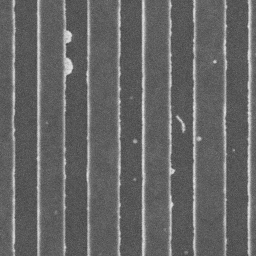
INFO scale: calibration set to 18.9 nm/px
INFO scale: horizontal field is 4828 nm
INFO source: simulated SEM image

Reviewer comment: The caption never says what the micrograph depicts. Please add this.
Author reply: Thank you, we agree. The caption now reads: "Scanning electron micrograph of lines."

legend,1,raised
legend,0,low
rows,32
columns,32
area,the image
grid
11000111000111100011100011110001
11000111000111100011100011110001
11000111000111100011100011110001
11000111000111100011100011110001
11000111100111100011100011110001
11000111000111100011100011110001
11000111000111100011100011110001
11000111100111100011100011110001
11000111100111100011100011110001
11000111000111100011100011110001
11000111000111100011100011110001
11000111000111100011100011110001
11000111000111100011100011110001
11000111000111100011100011110001
11000111000111100011100011110001
11000111000111100011100011110001
11000111000111100011100011110001
11000111000111100011100011110001
11000111000111100011100011110001
11000111000111100011100011110001
11000111000111100011100011110001
11000111000111100011100011110001
11000111000111100011100011110001
11000111000111100011100011110001
11000111000111100011100011110001
11000111000111100011100011110001
11000111000111100011100011110001
11000111000111100011100011110001
11000111000111100011100011110001
11000111000111100011100011110001
11000111000111100011100011110001
11000111000111100011100011110001